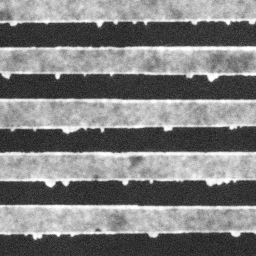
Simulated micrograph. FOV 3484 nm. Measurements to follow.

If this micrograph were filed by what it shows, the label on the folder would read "lines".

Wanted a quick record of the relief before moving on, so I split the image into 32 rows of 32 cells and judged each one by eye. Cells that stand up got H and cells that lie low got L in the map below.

HHHHHHHHHHHHHHHHHHHHHHHHHHHHHHHH
HHHHHHHHHHHHHHHHHHHHHHHHHHHHHHHH
HHHHHHHHHHHHHHHHHHHHHHHHHHHHHHLL
LLLLLLLLLLLLLLLLLLLLLLLLLLLLLLLL
LLLLLLLLLLLLLLLLLLLLLLLLLLLLLLLL
LLLLLLLLLLLLLLLLLLLLLLLLLLLLLLLL
HHHHHHHHHHHHHHHHHHHHHHHHHHHHHHHH
HHHHHHHHHHHHHHHHHHHHHHHHHHHHHHHH
HHHHHHHHHHHHHHHHHHHHHHHHHHHHHHHH
LLLLLLLLLLLLLLLLLLLLLLLLLLHLLLLL
LLLLLLLLLLLLLLLLLLLLLLLLLLLLLLLL
LLLLLLLLLLLLLLLLLLLLLLLLLLLLLLLL
HHHHHHHHHHHLLLLLLLLLLLLLLLLLLLLL
HHHHHHHHHHHHHHHHHHHHHHHHHHHHHHHH
HHHHHHHHHHHHHHHHHHHHHHHHHHHHHHHH
HHHHHHHHHHHHHHHHHHHHHHHHHHHHHHHH
LLLLLLLLLLLLLLLLLLLLLLLLLLLLLLLL
LLLLLLLLLLLLLLLLLLLLLLLLLLLLLLLL
LLLLLLLLLLLLLLLLLLLLLLLLLLLLLLLL
HHHHHHHHHHHHHHHHHHHHHHHHHHHHHHHH
HHHHHHHHHHHHHHHHHHHHHHHHHHHHHHHH
HHHHHHHHHHHHHHHHHHHHHHHHHHHHHHHH
HHHHHHHHHHHHHHHHLHLHHHLLLHHHLLLL
LLLLLLLLLLLLLLLLLLLLLLLLLLLLLLLL
LLLLLLLLLLLLLLLLLLLLLLLLLLLLLLLL
LLLLLLLLLLLLLLLLLLLLLLLLLLLLLLLL
HHHHHHHHHHHHHHHHHHHHHHHHHHHHHHHH
HHHHHHHHHHHHHHHHHHHHHHHHHHHHHHHH
HHHHHHHHHHHHHHHHHHHHHHHHHHHHHHHH
LLLLLLLLLLLLLLLLLLLLLLLLLLLLLLLL
LLLLLLLLLLLLLLLLLLLLLLLLLLLLLLLL
LLLLLLLLLLLLLLLLLLLLLLLLLLLLLLLL